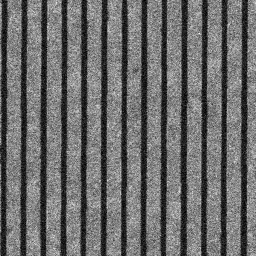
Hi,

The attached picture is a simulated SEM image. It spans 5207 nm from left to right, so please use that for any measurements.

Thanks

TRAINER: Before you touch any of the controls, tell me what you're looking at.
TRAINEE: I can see parallel lines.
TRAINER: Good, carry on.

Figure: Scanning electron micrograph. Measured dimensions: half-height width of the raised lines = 0.272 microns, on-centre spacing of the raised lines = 407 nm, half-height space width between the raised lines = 0.132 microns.